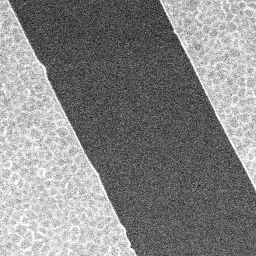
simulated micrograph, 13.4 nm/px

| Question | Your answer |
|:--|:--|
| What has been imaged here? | one or a few lines or trenches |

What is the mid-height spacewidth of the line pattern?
1830 nanometers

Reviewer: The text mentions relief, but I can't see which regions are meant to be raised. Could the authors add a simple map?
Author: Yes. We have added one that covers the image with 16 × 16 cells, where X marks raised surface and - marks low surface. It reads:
X---------XXXXXX
X----------XXXXX
XX---------XXXXX
XX----------XXXX
XXX---------XXXX
XXX----------XXX
XXXX---------XXX
XXXX----------XX
XXXXX---------XX
XXXXX----------X
XXXXXX---------X
XXXXXX----------
XXXXXXX---------
XXXXXXX---------
XXXXXXXX--------
XXXXXXXX--------